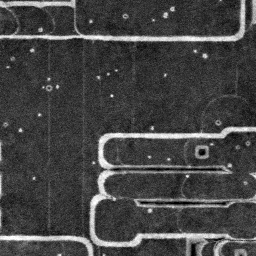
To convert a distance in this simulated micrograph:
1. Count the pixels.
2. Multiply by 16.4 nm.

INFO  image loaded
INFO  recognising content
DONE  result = wiring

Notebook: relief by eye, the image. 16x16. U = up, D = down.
UUUUUUUUUUUUUUUD
UUUUUUUUUUUUUUUD
DDDDDDDDDDDDDDDD
DDDDDDDDDDDDDDDD
DDDDDDDDDDDDDDDD
DDDDDDDDDDDDDDDD
DDDDDDDDDDDDDDDD
DDDDDDDDDDDDDDDD
DDDDDDDUUUDDUUUU
DDDDDDUUUUUUUUUU
DDDDDDDUUUUUUUUU
DDDDDDUUUUUUUUUU
DDDDDDUUUUUUUUUU
DDDDDDUUUUUUUUUU
DDDDDDUUUUUUUUUU
UUUUUUDDDDDDDDUU